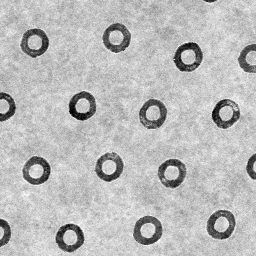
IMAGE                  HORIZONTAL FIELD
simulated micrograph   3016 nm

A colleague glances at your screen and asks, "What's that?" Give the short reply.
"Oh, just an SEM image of a regular array of ring-shaped grooves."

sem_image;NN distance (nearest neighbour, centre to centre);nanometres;795